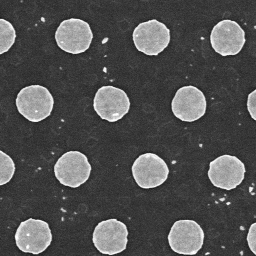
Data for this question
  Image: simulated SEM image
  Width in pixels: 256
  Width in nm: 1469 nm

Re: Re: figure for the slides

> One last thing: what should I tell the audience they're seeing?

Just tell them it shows a regular array of raised bodies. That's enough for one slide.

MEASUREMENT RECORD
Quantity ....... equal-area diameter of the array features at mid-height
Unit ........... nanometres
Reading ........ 201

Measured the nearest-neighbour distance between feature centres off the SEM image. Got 76.1 pixels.